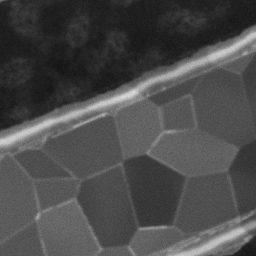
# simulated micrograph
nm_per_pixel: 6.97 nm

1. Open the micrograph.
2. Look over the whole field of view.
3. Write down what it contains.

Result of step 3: one or a few lines or trenches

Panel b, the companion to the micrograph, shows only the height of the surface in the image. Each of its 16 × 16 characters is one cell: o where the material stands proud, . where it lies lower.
................
................
...............o
.............ooo
...........ooooo
.........ooooooo
......oooooooooo
....oooooooooooo
.ooooooooooooooo
oooooooooooooooo
oooooooooooooooo
oooooooooooooooo
oooooooooooooooo
oooooooooooooooo
ooooooooooooooo.
ooooooooooooo...